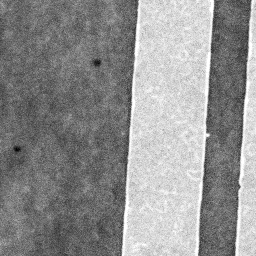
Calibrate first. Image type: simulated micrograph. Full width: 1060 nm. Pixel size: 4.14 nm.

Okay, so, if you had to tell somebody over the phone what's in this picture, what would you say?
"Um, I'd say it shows one or a few lines or trenches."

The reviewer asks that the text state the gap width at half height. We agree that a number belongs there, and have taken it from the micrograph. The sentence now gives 0.162 micrometres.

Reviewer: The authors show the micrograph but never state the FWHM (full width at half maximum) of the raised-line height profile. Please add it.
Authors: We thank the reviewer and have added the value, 0.307 microns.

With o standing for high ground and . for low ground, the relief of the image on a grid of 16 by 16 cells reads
.........oooo...
.........oooo...
.........oooo...
........ooooo...
........ooooo..o
........ooooo..o
........ooooo..o
........ooooo..o
........ooooo..o
........ooooo..o
........ooooo..o
........ooooo..o
........ooooo..o
........oooo...o
........oooo...o
........oooo...o